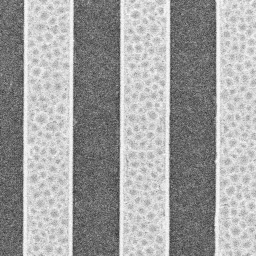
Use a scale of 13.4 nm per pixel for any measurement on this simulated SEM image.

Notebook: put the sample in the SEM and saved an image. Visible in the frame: one or a few lines or trenches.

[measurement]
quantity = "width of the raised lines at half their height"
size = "610 nanometers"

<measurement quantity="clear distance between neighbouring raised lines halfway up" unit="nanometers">674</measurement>